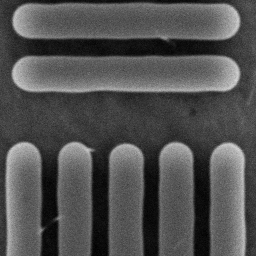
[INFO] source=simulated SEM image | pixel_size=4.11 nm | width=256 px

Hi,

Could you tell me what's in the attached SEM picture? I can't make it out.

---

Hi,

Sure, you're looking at groups of lines, slits or small figures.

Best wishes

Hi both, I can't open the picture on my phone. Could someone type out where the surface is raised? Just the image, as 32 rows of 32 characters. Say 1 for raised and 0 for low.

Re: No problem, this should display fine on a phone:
00000001111000011111001110000000
00111111111111111111111111111000
00111111111111111111111111111100
00111111111111111111111111111100
00011111111111111111111111111000
00000000000000000000000000000000
00000000000000000000000000000000
00011111111111111111111111111000
00111111111111111111111111111100
00111111111111111111111111111100
00111111111111111111111111111000
00000000000000000000000000000000
00000000000000000000000000000000
00000000000000000000000000000000
00000000000000000000000000000000
00000000000000000000000000000000
00000000000000000000000000000000
00000000000000000000000000000000
00110000111000011000011000011100
01111001111000111100111100011100
01111001111000111100111100111100
01111001111000111100111100111100
01111001111000111100111100111100
01111001111000111100111100111100
01111001111000111100111100111100
01111001111000111100111100111100
01111001111000111100111100111100
01111001111000111100111100111100
01111001111000111100111100111110
01111001111000111100111100111110
01111001111000111100111100111110
01111001111000111100111100111110